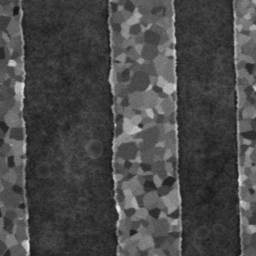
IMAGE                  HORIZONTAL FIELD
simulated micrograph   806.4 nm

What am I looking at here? one or a few lines or trenches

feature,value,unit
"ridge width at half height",200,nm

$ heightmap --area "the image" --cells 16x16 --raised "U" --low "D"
UDDDDDDUUUUDDDDU
UDDDDDDUUUUDDDDU
UDDDDDDUUUUDDDDU
UDDDDDDUUUUDDDDU
UUDDDDDUUUUDDDDU
UDDDDDDUUUUDDDDU
UDDDDDDUUUUDDDDU
UDDDDDDUUUUDDDDU
UUDDDDDUUUUDDDDU
UUDDDDDUUUUDDDDU
UUDDDDDUUUUDDDDU
UUDDDDDUUUUDDDDU
UUDDDDDUUUUDDDDU
UUDDDDDUUUUDDDDU
UUDDDDDUUUUDDDDU
UUDDDDDUUUUDDDDU